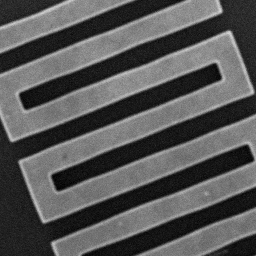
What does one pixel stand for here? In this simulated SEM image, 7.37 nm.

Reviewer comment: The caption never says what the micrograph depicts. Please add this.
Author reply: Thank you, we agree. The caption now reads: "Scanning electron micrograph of groups of lines, slits or small figures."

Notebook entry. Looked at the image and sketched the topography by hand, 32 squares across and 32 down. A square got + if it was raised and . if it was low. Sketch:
........+++++++.......+++++.....
.....++++++++.......+++++++.....
...+++++++.......++++++++.......
++++++++.......++++++++.........
+++++.......++++++++.......++...
++.......++++++++........++++...
.......++++++++.......++++++++..
.....+++++++........++++++++++..
..++++++++.......++++++++..++++.
+++++++.......++++++++......+++.
+++++.......++++++++.......++++.
+++......++++++++.......+++++++.
++.....++++++++.......+++++++...
+++..+++++++........+++++++.....
++++++++++.......+++++++........
+++++++.......++++++++........++
.+++........+++++++........+++++
.........++++++++.......++++++++
......++++++++........+++++++..+
....++++++++.......++++++++.....
...++++++.......++++++++.......+
...++++.......++++++++.......+++
...+++.....++++++++.......++++++
....+++..++++++++.......+++++++.
....++++++++++.......++++++++...
....++++++++.......++++++++.....
.....++++.......++++++++.......+
.....+.......++++++++.......++++
...........++++++++......+++++++
.........+++++++.......++++++++.
.......++++++........+++++++....
.......++++.......++++++++......